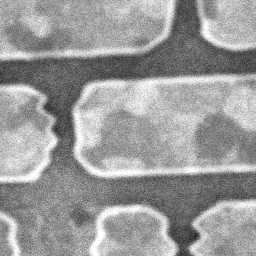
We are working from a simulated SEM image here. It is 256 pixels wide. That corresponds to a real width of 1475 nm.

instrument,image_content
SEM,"one or a few lines or trenches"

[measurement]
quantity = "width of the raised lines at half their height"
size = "526 nm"